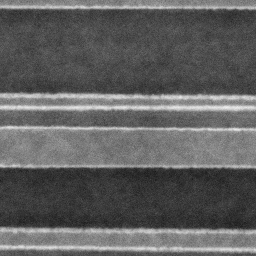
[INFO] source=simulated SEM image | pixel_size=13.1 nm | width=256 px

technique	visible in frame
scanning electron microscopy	lines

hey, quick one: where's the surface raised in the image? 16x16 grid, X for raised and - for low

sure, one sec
--------------XX
----------------
----------------
----------------
----------------
----------------
XXXXXXXXXXXXXXXX
XXXXXXXXXXXXXXXX
XXXXXXXXXXXXXXXX
XXXXXXXXXXXXXXXX
----------------
----------------
----------------
----------------
XXXXXXXXX-X-----
XXXXXXXXXXXXXXXX